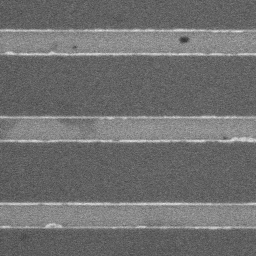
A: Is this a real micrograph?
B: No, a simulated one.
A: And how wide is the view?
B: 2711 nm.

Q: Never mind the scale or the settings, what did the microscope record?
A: lines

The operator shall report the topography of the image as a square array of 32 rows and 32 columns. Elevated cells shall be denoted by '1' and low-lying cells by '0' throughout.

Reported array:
11111111111111111111111111111111
11111111111111111111111111111111
11111111111111111111111111111111
11111111111111111111111111111111
00000000000000000000000000000000
00000000000000000000000000000000
00000000000000000000000000000000
11111111111111111111111111111111
11111111111111111111111111111111
11111111111111111111111111111111
11111111111111111111111111111111
11111111111111111111111111111111
11111111111111111111111111111111
11111111111111111111111111111111
11111111111111111111111111111111
00000000000000000000000000000000
00000000000000000000000000000000
00000000000000000000000000000000
11111111111111111111111111111111
11111111111111111111111111111111
11111111111111111111111111111111
11111111111111111111111111111111
11111111111111111111111111111111
11111111111111111111111111111111
11111111111111111111111111111111
11111111111111111111111111111111
00000000000000000000000000000000
00000000000000000000000000000000
11111111111111111111111111111111
11111111111111111111111111111111
11111111111111111111111111111111
11111111111111111111111111111111